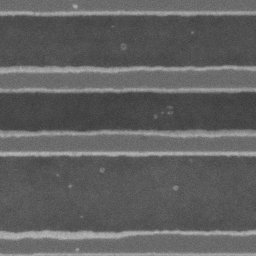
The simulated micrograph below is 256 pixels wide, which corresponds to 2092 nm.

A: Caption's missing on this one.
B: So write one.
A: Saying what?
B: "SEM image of lines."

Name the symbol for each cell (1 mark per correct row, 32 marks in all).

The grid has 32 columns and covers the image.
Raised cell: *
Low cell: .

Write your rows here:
********************************
********************************
................................
................................
................................
................................
................................
................................
................*****..*********
********************************
********************************
................................
................................
................................
................................
................................
............**..................
********************************
********************************
................................
................................
................................
................................
................................
................................
................................
................................
................................
................................
********************************
********************************
********************************